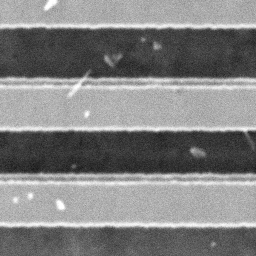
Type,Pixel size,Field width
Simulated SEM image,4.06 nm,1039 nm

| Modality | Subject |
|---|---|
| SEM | lines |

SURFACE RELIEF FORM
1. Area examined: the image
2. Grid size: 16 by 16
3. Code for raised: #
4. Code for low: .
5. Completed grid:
################
################
................
................
................
################
################
################
................
................
................
################
################
################
................
................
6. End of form